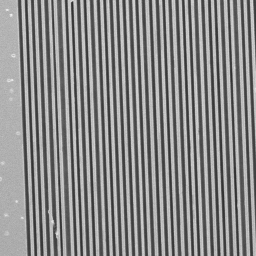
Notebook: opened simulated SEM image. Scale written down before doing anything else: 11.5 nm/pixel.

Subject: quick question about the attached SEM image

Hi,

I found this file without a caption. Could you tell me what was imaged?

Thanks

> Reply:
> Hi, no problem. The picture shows parallel lines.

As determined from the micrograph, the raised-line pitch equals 75.1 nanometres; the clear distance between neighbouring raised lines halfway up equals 31.6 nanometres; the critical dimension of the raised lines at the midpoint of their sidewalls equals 40.2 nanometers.